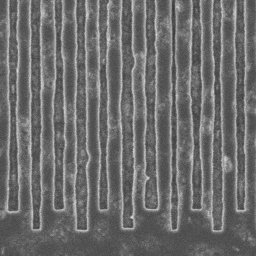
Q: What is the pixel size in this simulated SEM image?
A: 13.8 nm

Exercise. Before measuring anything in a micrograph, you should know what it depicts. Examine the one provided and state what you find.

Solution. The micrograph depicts parallel lines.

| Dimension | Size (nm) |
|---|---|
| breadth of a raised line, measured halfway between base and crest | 182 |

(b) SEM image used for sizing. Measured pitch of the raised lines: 312 nm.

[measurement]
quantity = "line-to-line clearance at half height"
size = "127 nm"